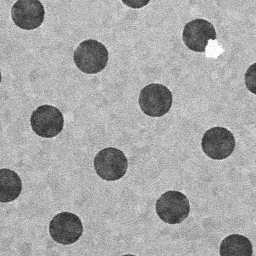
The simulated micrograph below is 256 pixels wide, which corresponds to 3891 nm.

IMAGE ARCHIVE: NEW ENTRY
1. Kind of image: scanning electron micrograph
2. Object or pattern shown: a regular array of holes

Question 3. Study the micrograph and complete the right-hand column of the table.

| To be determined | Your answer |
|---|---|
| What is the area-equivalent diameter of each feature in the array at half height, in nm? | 517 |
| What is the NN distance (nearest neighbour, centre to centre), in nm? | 1160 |